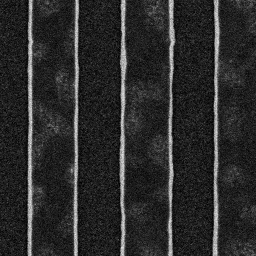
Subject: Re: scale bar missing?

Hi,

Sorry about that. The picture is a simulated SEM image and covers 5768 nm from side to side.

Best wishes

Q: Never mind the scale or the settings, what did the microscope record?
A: one or a few lines or trenches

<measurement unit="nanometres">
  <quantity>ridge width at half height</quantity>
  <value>1070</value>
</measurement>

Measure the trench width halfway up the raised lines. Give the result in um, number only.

1.01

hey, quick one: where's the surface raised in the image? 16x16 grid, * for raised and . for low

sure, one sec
..***...***..***
..***...***...**
..***...***...**
..***...***...**
..***...***...**
..***...***...**
..***...***..***
..***...***..***
..***...***..***
..***...***..***
..***...***...**
..***...***..***
..***...***..***
..***...***..***
..***...***..***
..***...***..***